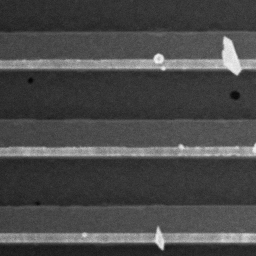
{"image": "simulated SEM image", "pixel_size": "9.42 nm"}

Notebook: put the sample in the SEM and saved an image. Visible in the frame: lines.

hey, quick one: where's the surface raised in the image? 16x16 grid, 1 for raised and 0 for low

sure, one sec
0000000000000000
0000000000000000
1111111111111111
1111111111111111
0000000000000000
0000000000000000
0000000000000000
0000000000000000
1111111111111111
1111111111111111
0000000000000000
0000000000000000
0000000000000000
1111111111111111
1111111111111111
0000000000000000